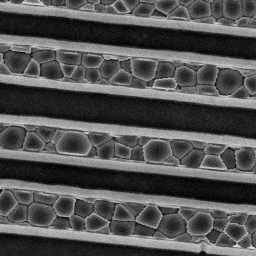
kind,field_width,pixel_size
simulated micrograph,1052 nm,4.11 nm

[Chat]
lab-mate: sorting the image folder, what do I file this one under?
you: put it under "one or a few lines or trenches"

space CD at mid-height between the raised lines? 0.131 um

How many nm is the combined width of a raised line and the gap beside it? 302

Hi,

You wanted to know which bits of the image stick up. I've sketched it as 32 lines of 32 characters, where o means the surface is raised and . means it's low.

oooooooooooooooooooooooooooooooo
........oooooooooooooooooooooooo
.................ooooooooooooooo
...........................ooooo
................................
oooooo..........................
ooooooooooooooo.................
oooooooooooooooooooooooooo......
oooooooooooooooooooooooooooooooo
oooooooooooooooooooooooooooooooo
.......ooooooooooooooooooooooooo
..................oooooooooooooo
...........................ooooo
................................
................................
ooooooo.........................
ooooooooooooooooo...............
ooooooooooooooooooooooooooo.....
oooooooooooooooooooooooooooooooo
....oooooooooooooooooooooooooooo
..............oooooooooooooooooo
.........................ooooooo
................................
ooooo...........................
oooooooooooooo..................
oooooooooooooooooooooooo........
oooooooooooooooooooooooooooooooo
oooooooooooooooooooooooooooooooo
..oooooooooooooooooooooooooooooo
............oooooooooooooooooooo
......................oooooooooo
..............................oo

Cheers